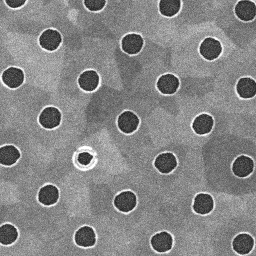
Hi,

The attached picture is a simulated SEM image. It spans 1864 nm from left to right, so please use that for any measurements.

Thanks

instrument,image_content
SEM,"a regular array of holes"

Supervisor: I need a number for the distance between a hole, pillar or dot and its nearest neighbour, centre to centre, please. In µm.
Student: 0.391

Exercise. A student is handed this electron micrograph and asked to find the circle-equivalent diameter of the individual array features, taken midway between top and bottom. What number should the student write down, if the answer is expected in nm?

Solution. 160